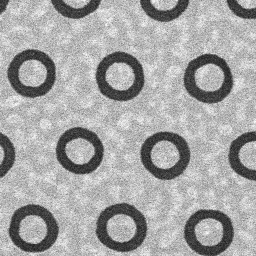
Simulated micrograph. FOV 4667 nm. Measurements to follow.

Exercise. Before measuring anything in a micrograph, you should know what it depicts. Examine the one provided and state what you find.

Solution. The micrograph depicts ring-shaped grooves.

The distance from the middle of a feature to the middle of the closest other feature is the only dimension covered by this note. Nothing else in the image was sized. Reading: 1530 nm